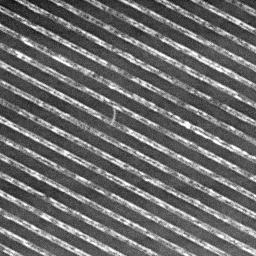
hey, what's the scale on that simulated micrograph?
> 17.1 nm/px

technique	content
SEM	parallel lines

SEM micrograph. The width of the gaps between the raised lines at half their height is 201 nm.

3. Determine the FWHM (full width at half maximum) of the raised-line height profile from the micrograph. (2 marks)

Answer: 79.5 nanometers